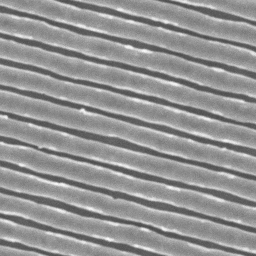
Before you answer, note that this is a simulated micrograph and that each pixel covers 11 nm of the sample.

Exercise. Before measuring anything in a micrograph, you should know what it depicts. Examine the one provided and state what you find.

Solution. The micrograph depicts parallel lines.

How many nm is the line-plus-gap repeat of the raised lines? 276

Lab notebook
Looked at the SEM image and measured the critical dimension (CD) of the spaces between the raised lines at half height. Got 74.8 nm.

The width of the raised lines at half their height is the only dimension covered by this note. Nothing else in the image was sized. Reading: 207 nm